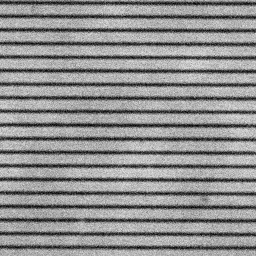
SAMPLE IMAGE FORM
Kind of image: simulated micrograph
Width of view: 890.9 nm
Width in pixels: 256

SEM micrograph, parallel lines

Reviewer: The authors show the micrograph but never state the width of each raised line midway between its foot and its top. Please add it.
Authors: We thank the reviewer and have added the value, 10 pixels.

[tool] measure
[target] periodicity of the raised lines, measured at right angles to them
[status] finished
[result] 47.3 nm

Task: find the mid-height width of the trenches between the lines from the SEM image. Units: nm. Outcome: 10.4